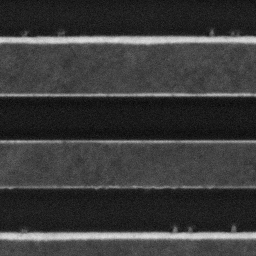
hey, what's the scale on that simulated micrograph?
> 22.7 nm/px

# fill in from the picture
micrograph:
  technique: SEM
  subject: lines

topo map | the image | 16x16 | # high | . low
................
................
################
################
################
################
................
................
................
################
################
################
................
................
................
################